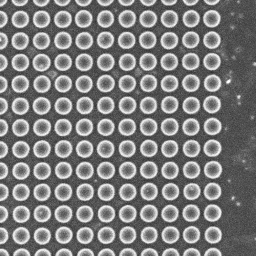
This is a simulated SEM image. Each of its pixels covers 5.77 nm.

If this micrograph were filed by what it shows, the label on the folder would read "a regular array of raised bodies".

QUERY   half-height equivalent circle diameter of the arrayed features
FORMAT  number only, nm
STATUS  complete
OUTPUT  93.8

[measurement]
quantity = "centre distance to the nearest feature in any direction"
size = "0.122 um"